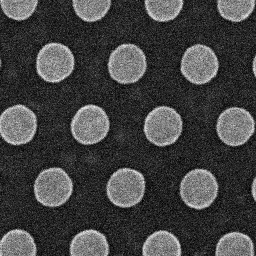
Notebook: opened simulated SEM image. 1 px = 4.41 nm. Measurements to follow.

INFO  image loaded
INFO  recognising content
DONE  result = a regular array of raised bodies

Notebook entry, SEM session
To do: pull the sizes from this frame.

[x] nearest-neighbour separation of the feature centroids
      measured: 71.8 px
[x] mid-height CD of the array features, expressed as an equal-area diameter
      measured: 166 nanometers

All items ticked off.